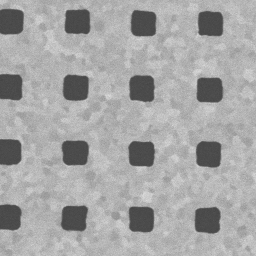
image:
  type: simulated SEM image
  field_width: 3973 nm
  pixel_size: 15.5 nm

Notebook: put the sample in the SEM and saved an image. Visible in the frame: a regular array of holes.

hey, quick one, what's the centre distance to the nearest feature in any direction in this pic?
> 1.01 µm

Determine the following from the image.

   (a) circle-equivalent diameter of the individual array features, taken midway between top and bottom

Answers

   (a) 429 nanometres